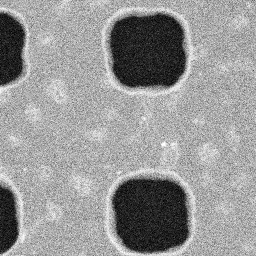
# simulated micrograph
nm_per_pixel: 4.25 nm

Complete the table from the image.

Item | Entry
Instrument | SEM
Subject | holes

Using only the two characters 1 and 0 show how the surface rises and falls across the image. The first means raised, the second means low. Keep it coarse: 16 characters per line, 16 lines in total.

1111111111111111
0111111000011111
0011111000001111
0011111000001111
0011111000001111
1111111100011111
1111111111111111
1111111111111111
1111111111111111
1111111111111111
1111111111111111
1111111000011111
0111111000001111
0111111000001111
0111111000001111
0111111100011111